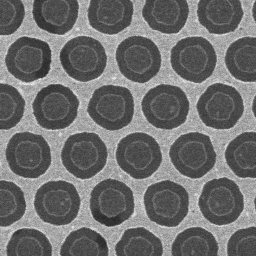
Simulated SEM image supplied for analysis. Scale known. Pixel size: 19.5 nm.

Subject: a regular array of ring-shaped grooves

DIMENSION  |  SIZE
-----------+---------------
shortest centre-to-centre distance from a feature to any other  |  1060 nm